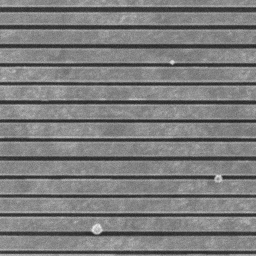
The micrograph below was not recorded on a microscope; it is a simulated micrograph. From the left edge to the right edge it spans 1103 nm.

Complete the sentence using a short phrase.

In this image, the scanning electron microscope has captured parallel lines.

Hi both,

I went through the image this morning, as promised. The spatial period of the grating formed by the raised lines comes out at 80.5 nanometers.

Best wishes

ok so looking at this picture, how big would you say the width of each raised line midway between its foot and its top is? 61.4 nm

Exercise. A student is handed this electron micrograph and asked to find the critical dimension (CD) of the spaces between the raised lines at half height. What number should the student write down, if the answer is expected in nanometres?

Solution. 20.5